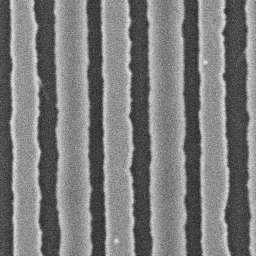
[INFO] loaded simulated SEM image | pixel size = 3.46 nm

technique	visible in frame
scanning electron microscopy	lines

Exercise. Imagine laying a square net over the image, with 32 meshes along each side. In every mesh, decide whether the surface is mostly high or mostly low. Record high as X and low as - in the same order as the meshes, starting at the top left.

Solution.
-XXX---XXXX--XXX--XXXXX--XXX---X
-XXX---XXXX--XXX--XXXXX--XXX---X
-XXX---XXXX--XXX---XXXX--XXX---X
-XXXX--XXXX--XXX---XXXX--XXX---X
-XXX---XXXX--XXX---XXXX--XXX---X
-XXX---XXXX--XXX---XXXX--XXX---X
-XXXX--XXXX--XXX---XXXX--XXX---X
--XXX--XXXX--XXX---XXXX--XXX---X
--XXX--XXXX--XXX---XXXX--XXX---X
-XXXX--XXXX--XXX---XXXX--XXX---X
-XXXX--XXXX--XXX---XXXX--XXX---X
--XXX--XXXX--XXX---XXXX--XXX---X
--XXX--XXXX--XXX---XXXX--XXX---X
--XXX--XXXX--XXX---XXXX--XXX---X
--XXX--XXXX--XXX---XXXX--XXX---X
-XXXX--XXXX--XXX---XXXX--XXX---X
-XXXX--XXXX--XXX---XXXX--XXX---X
--XXX--XXXX--XXX---XXXX--XXX---X
--XXX--XXXX--XXXX--XXXX--XXX---X
--XXX--XXXX--XXX---XXXX--XXX---X
--XXX--XXXX--XXX---XXXX--XXX---X
--XXX--XXXX--XXX---XXXX--XXXX--X
--XXX--XXXX--XXX---XXXX--XXXX--X
--XXX--XXXX--XXXX--XXXX--XXXX--X
--XXX--XXXX--XXXX--XXXX--XXX---X
--XXX--XXXX--XXXX--XXXX--XXX---X
--XXX--XXXX--XXXX--XXXX--XXX---X
--XXX--XXXX--XXXX--XXXX--XXX---X
--XXX---XXX--XXXX--XXXX--XXX---X
--XXX---XXX--XXXX--XXXX--XXX---X
--XXX---XXXX-XXXX--XXXX--XXX---X
--XXX--XXXX--XXXX--XXXX--XXXX--X